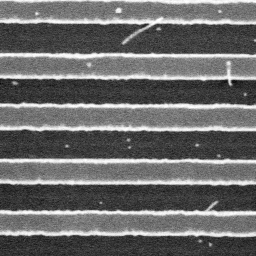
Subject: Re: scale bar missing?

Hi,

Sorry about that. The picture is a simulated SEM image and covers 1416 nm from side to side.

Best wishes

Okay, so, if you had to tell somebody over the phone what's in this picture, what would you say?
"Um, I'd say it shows lines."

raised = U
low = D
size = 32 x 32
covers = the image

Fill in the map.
UUUUUUUUUUUUUUUUUUUUUUUUUUUUUUUU
UUUUUUUUUUUUUUUUUUUUUUUUUUUUUUUU
UUUUUUUUUUUUUUUUUUUUUUUUUUUUUUUU
DDDDDDDDDDDDDDDDDDDDDDDDDDDDDDDD
DDDDDDDDDDDDDDDDDDDDDDDDDDDDDDDD
DDDDDDDDDDDDDDDDDDDDDDDDDDDDDDDD
DDDDDDDDDDDDDDDDDDDDDDDDDDDDDDDD
UUUUUUUUUUUUUUUUUUUUUUUUUUUUUUUU
UUUUUUUUUUUUUUUUUUUUUUUUUUUUUUUU
UUUUUUUUUUUUUUUUUUUUUUUUUUUUUUUU
DDDDDDDDDDDDDDDDDDDDDDDDDDDDDDDD
DDDDDDDDDDDDDDDDDDDDDDDDDDDDDDDD
DDDDDDDDDDDDDDDDDDDDDDDDDDDDDDDD
UUUUUUUUUUUUUUUUUUUUUUUUUUUUUUUU
UUUUUUUUUUUUUUUUUUUUUUUUUUUUUUUU
UUUUUUUUUUUUUUUUUUUUUUUUUUUUUUUU
DDDDDDDDDDDDDDDDDDDDDDDDDDDDDDDD
DDDDDDDDDDDDDDDDDDDDDDDDDDDDDDDD
DDDDDDDDDDDDDDDDDDDDDDDDDDDDDDDD
DDDDDDDDDDDDDDDDDDDDDDDDDDDDDDDD
UUUUUUUUUUUUUUUUUUUUUUUUUUUUUUUU
UUUUUUUUUUUUUUUUUUUUUUUUUUUUUUUU
UUUUUUUUUUUUUUUUUUUUUUUUUUUUUUUU
DDDDDDDDDDDDDDDDDDDDDDDDDDDDDDDD
DDDDDDDDDDDDDDDDDDDDDDDDDDDDDDDD
DDDDDDDDDDDDDDDDDDDDDDDDDDDDDDDD
UUUUUUUUUUUUUUUUUUUDUUUDUDUDDDDD
UUUUUUUUUUUUUUUUUUUUUUUUUUUUUUUU
UUUUUUUUUUUUUUUUUUUUUUUUUUUUUUUU
DDDDDDDDDDDDDDDDDDDDDDDDDDUUUUUU
DDDDDDDDDDDDDDDDDDDDDDDDDDDDDDDD
DDDDDDDDDDDDDDDDDDDDDDDDDDDDDDDD